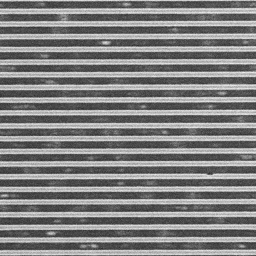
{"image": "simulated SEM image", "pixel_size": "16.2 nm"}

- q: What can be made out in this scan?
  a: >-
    parallel lines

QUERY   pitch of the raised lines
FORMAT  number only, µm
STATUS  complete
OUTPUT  0.207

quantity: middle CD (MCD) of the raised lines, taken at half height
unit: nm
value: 65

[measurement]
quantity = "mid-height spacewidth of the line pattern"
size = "142 nm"